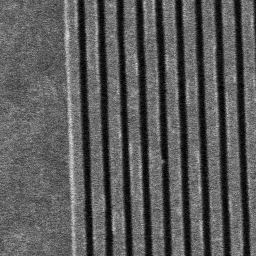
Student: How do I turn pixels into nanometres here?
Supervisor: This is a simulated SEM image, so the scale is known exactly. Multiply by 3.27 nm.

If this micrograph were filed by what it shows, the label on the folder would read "parallel lines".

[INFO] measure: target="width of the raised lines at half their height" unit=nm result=41.7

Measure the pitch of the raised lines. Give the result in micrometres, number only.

0.064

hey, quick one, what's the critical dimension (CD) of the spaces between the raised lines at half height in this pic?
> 23.7 nm